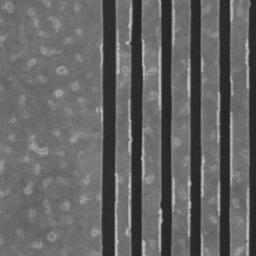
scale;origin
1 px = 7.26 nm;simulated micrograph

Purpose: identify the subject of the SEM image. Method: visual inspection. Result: parallel lines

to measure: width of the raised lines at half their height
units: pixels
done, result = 19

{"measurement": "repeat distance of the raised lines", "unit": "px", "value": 29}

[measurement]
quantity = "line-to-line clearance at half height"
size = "78.9 nm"